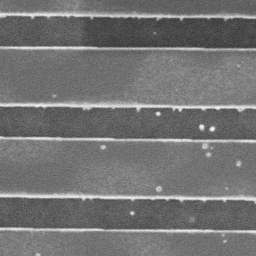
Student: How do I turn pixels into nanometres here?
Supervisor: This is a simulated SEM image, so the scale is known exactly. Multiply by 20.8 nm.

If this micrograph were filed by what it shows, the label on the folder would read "lines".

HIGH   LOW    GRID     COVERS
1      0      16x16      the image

1111111111111111
0000000000000000
0000000000000000
1111111111111111
1111111111111111
1111111111111111
1111111111111111
0000000000000000
0000000000000000
1111111111111111
1111111111111111
1111111111111111
0000000000000000
0000000000000000
1111111111111111
1111111111111111